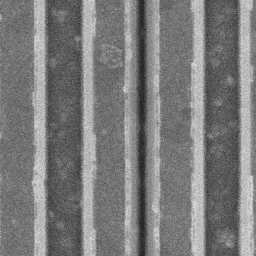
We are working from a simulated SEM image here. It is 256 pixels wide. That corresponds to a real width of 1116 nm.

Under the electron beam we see one or a few lines or trenches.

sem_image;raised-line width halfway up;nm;200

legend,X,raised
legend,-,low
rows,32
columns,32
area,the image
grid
XXXXX------XXXXX---XXXXXX------X
XXXXX------XXXXX---XXXXXX------X
XXXXX------XXXXX---XXXXXX------X
XXXXX------XXXXX---XXXXXX------X
XXXXX------XXXXX---XXXXXX------X
XXXXX------XXXXX---XXXXXX------X
XXXXX------XXXXX---XXXXXX------X
XXXXX------XXXXX---XXXXXX------X
XXXXX------XXXXX---XXXXXX------X
XXXXX------XXXXX---XXXXXX------X
XXXXX------XXXXX---XXXXXX------X
XXXXX------XXXXX---XXXXXX------X
XXXXX------XXXXX---XXXXXX------X
XXXXX------XXXXX---XXXXXX------X
XXXXX------XXXXX---XXXXXX------X
XXXXX------XXXXX---XXXXXX------X
XXXXX------XXXXX---XXXXXX------X
XXXXX------XXXXX---XXXXXX------X
XXXXX------XXXXX---XXXXXX------X
XXXXX------XXXXX---XXXXXX------X
XXXXX------XXXXX---XXXXXX------X
XXXXX------XXXXX---XXXXXX------X
XXXXX------XXXXX---XXXXXX------X
XXXXX------XXXXX---XXXXXX------X
XXXXX------XXXXX---XXXXXX------X
XXXXX------XXXXX---XXXXXX------X
XXXXX------XXXXX---XXXXXX------X
XXXXX------XXXXX---XXXXXX------X
XXXXX------XXXXXX--XXXXXX------X
XXXXX------XXXXX---XXXXXX------X
XXXXX------XXXXX---XXXXXX------X
XXXXX------XXXXX---XXXXXX------X